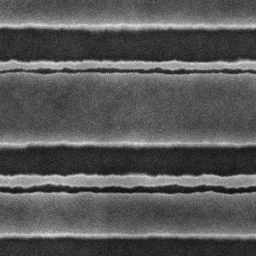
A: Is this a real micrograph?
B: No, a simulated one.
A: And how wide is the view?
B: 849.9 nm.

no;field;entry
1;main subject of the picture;lines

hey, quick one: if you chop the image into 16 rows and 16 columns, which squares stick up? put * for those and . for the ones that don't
****************
****************
................
................
****************
****************
****************
****************
****************
................
................
****************
****************
****************
****************
................